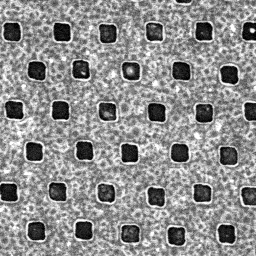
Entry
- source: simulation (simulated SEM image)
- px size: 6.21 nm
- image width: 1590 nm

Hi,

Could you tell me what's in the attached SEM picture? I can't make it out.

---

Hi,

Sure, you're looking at a regular array of holes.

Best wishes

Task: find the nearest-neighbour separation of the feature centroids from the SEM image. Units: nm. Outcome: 282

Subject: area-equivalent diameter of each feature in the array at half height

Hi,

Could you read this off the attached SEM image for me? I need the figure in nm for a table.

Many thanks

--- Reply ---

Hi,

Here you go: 126